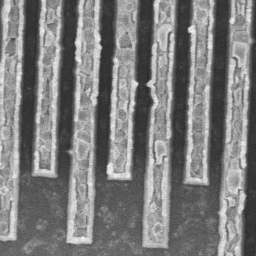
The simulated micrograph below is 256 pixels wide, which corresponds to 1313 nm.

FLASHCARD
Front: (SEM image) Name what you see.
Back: parallel lines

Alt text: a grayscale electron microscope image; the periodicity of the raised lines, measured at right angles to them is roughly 195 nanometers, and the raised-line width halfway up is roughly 115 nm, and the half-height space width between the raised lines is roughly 81.3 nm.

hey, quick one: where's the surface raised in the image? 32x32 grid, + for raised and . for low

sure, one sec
+++..+++..+++..++..+++..+++..+++
+++..+++..+++..++..+++..+++..++.
+++..+++..++..+++..+++..+++..++.
+++..+++..++..+++..+++..+++..++.
+++..+++..++..+++..+++..+++..++.
+++..+++.++++.+++..+++..+++..++.
+++..+++.++++.+++..+++..+++..++.
+++..+++..++..+++..+++..+++..++.
+++..++...++..+++..+++..++...++.
+++..++..+++..+++..+++..++...++.
+++..++..+++..+++..+++..++..+++.
+++..++..+++..+++..+++..++..+++.
+++..++..+++..+++..+++..++..+++.
++...++..+++..+++..++...++..+++.
++..+++..+++..+++..++...++..+++.
++..+++..+++..+++..++..+++..+++.
++..+++..+++..+++..++..+++..+++.
++..+++..+++..+++..++..+++..+++.
++..+++..+++..++...++..+++..+++.
++..+++..+++..++...++..+++..+++.
++..+++..+++..++..+++..+++..+++.
++..+++..+++.+++..+++..+++..+++.
++.......++.......+++..+++..+++.
++.......+++......+++.......+++.
++.......+++......+++.......+++.
++.......++.......+++.......++..
++.......++.......+++.......++..
++.......++.......+++.......++..
++.......++.......+++.......++..
++......+++.......+++.......++..
..................++........++..
...........................+++..